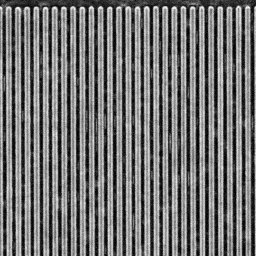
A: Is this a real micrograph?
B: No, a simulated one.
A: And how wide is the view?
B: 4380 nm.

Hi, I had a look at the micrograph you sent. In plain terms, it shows parallel lines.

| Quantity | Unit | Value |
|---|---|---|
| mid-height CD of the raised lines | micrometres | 0.0599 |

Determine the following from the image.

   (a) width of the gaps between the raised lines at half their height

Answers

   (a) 89.8 nm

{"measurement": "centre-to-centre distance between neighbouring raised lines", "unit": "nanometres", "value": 157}